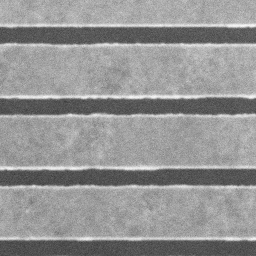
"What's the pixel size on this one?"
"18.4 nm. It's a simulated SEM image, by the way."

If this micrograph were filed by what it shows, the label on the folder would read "lines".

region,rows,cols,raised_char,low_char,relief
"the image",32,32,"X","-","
XXXXXXXXXXXXXXXXXXXXXXXXXXXXXXXX
XXXXXXXXXXXXXXXXXXXXXXXXXXXXXXXX
XXXXXXXXXXXXXXXXXXXXXXXXXXXXXXXX
--------------------------------
--------------------------------
--------------------X-----------
XXXXXXXXXXXXXXXXXXXXXXXXXXXXXXXX
XXXXXXXXXXXXXXXXXXXXXXXXXXXXXXXX
XXXXXXXXXXXXXXXXXXXXXXXXXXXXXXXX
XXXXXXXXXXXXXXXXXXXXXXXXXXXXXXXX
XXXXXXXXXXXXXXXXXXXXXXXXXXXXXXXX
XXXXXXXXXXXXXXXXXXXXXXXXXXXXXXXX
--------------------------------
--------------------------------
--X----XXXXXXX--XXXXXXXXX--XXXXX
XXXXXXXXXXXXXXXXXXXXXXXXXXXXXXXX
XXXXXXXXXXXXXXXXXXXXXXXXXXXXXXXX
XXXXXXXXXXXXXXXXXXXXXXXXXXXXXXXX
XXXXXXXXXXXXXXXXXXXXXXXXXXXXXXXX
XXXXXXXXXXXXXXXXXXXXXXXXXXXXXXXX
XXXXXXXXXXXXXXXXXXXXXXXXXXXXXXXX
--------------------------------
--------------------------------
XXXXXXXXXXXXXXXXXXXXXXXXXXXXXXXX
XXXXXXXXXXXXXXXXXXXXXXXXXXXXXXXX
XXXXXXXXXXXXXXXXXXXXXXXXXXXXXXXX
XXXXXXXXXXXXXXXXXXXXXXXXXXXXXXXX
XXXXXXXXXXXXXXXXXXXXXXXXXXXXXXXX
XXXXXXXXXXXXXXXXXXXXXXXXXXXXXXXX
XXXXXXXXXXXXXXXXXXXXXXXXXXXXXXXX
--------------------------------
--------------------------------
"